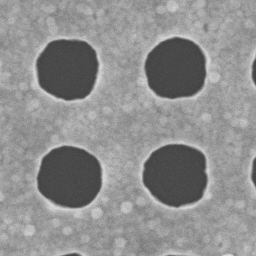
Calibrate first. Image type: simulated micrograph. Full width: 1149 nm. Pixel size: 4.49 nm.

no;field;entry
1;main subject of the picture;holes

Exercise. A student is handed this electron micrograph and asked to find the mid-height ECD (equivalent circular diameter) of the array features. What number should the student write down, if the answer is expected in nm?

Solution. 288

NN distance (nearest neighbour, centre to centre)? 107 px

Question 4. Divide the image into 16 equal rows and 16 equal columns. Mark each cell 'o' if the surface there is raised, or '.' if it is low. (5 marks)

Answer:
oooooooooooooooo
oooooooooooooooo
oooo.ooooo..oooo
oo....ooo....ooo
oo....ooo....ooo
ooo...ooo....ooo
oooooooooooooooo
oooooooooooooooo
oooooooooooooooo
ooo..ooooo...ooo
oo....ooo....ooo
oo....ooo....ooo
ooo...oooo..oooo
oooooooooooooooo
oooooooooooooooo
oooooooooooooooo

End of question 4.